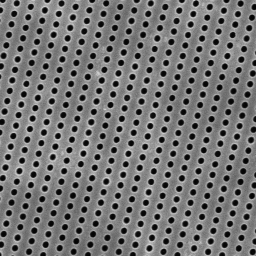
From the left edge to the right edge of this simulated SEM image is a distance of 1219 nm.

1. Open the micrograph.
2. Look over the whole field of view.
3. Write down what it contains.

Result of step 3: a regular array of holes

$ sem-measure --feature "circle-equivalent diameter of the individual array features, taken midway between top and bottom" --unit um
0.0294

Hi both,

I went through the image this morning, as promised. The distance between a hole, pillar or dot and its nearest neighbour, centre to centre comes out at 51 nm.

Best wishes